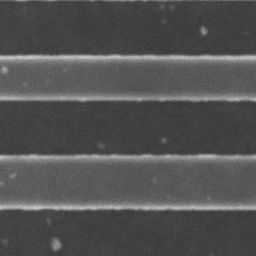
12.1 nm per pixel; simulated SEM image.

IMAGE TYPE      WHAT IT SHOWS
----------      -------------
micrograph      lines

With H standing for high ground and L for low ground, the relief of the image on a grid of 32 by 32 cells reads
LLLLLLLLLLLLLLLLLLLLLLLLLLLLLLLL
LLLLLLLLLLLLLLLLLLLLLLLLLLLLLLLL
LLLLLLLLLLLLLLLLLLLLLLLLLLLLLLLL
LLLLLLLLLLLLLLLLLLLLLLLLLLLLLLLL
LLLLLLLLLLLLLLLLLLLLLLLLLLLLLLLL
LLLLLLLLLLLLLLLLLLLLLLLLLLLLLLLL
LLLLLLLLLLLLLLLLLLLLLLLLLLLLLLLL
HHHHHHHHHHHHHHHHHHHHHHHHHHHHHHHH
HHHHHHHHHHHHHHHHHHHHHHHHHHHHHHHH
HHHHHHHHHHHHHHHHHHHHHHHHHHHHHHHH
HHHHHHHHHHHHHHHHHHHHHHHHHHHHHHHH
HHHHHHHHHHHHHHHHHHHHHHHHHHHHHHHH
LLLLLLLLLLHLLLLLLHLLHLLHHHLLHHLH
LLLLLLLLLLLLLLLLLLLLLLLLLLLLLLLL
LLLLLLLLLLLLLLLLLLLLLLLLLLLLLLLL
LLLLLLLLLLLLLLLLLLLLLLLLLLLLLLLL
LLLLLLLLLLLLLLLLLLLLLLLLLLLLLLLL
LLLLLLLLLLLLLLLLLLLLLLLLLLLLLLLL
LLLLLLLLLLLLLLLLLLLLLLLLLLLLLLLL
LLLHLLLLLLHHLLLLLLHLHLLLHHHLLLLL
HHHHHHHHHHHHHHHHHHHHHHHHHHHHHHHH
HHHHHHHHHHHHHHHHHHHHHHHHHHHHHHHH
HHHHHHHHHHHHHHHHHHHHHHHHHHHHHHHH
HHHHHHHHHHHHHHHHHHHHHHHHHHHHHHHH
HHHHHHHHHHHHHHHHHHHHHHHHHHHHHHHH
HHHHHHHHHHHHHHHHHHHHHHHHHHHHHHHH
LLLLLLLLLLLLLLLLLLLLLLLLLLLLLLLL
LLLLLLLLLLLLLLLLLLLLLLLLLLLLLLLL
LLLLLLLLLLLLLLLLLLLLLLLLLLLLLLLL
LLLLLLLLLLLLLLLLLLLLLLLLLLLLLLLL
LLLLLLLLLLLLLLLLLLLLLLLLLLLLLLLL
LLLLLLLLLLLLLLLLLLLLLLLLLLLLLLLL